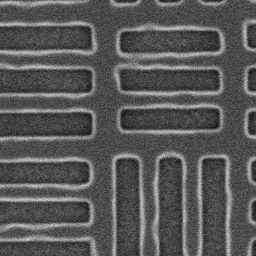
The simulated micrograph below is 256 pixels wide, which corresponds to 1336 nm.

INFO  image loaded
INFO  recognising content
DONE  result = groups of lines, slits or small figures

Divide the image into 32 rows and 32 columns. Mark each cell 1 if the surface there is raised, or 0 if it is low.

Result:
11111111111111111111111111111111
11111111111111111111111111111111
11111111111111111111111111111111
00000000000111111111111111111110
00000000000011100000000000011110
00000000000011100000000000001110
11000111111111100000000000011111
11111111111111111111111111111111
01100000011111100010010111111110
00000000000011100000000000011110
00000000000011100000000000001110
00000000000111111000001100011111
11111111111111111111111111111111
11111111111111111110000000011111
00000000000011100000000000001110
00000000000011100000000000011110
00000000000011111111111111111110
11111111111111111111111111111111
11111111111111111111111111111111
11111111111111111111001111111111
00000000000111000111000110001110
00000000000111000011000110001110
00000000000111000011000110001111
11111111111111000011000110001111
11111111111111000011000110001111
00000000000111000011000110000111
00000000000111000011000110001110
00000000000111000011000110001111
11111111111111000010000110001111
11111111111111000011000110001111
00000000000111000011000110001111
00000000000011000011000110001110